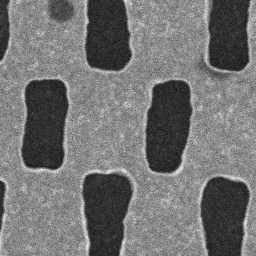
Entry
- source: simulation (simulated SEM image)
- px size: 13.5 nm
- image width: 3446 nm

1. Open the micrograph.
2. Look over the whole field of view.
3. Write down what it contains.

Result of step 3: holes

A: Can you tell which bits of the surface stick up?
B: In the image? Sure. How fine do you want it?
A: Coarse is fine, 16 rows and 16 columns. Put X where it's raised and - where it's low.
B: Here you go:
-XXXX---XXXXX---
-XXXX---XXXXX--X
-XXXX---XXXXX---
XXXXX---XXXXX---
XXXXXXXXXXXXXXXX
XX--XXXXXX--XXXX
XX--XXXXX---XXXX
XX--XXXXX---XXXX
X---XXXXX---XXXX
X---XXXXX--XXXXX
XX--XXXXX--XXXXX
XXXXX---XXXXX--X
XXXXX---XXXXX---
XXXXX---XXXXX--X
XXXXX---XXXXX--X
XXXXXX--XXXXX--X